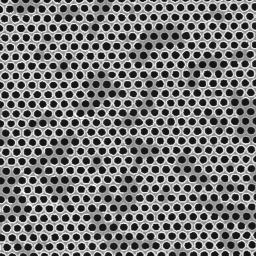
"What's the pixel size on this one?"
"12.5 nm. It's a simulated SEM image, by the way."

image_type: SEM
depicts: a regular array of holes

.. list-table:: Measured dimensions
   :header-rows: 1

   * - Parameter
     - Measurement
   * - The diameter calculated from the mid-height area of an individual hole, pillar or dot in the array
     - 96.5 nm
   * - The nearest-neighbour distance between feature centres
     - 10.4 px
